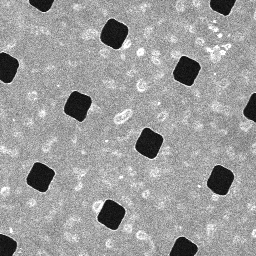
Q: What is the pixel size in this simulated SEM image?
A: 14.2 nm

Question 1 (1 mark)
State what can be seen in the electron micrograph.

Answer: holes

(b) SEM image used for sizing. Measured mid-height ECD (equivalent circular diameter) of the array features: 386 nm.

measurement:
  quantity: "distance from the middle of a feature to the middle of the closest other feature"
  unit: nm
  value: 1150